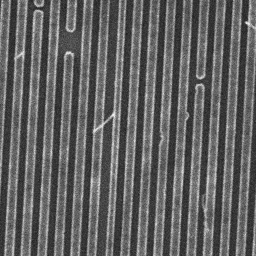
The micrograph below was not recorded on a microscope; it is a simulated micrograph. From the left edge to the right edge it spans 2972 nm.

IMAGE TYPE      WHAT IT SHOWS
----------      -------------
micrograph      parallel lines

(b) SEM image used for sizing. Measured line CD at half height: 101 nm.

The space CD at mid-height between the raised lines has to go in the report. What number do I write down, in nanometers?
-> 92.8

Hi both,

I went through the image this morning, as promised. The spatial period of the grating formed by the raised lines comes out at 192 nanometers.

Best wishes